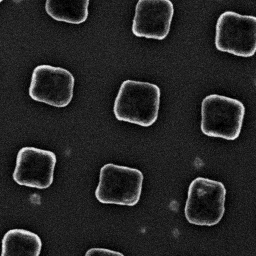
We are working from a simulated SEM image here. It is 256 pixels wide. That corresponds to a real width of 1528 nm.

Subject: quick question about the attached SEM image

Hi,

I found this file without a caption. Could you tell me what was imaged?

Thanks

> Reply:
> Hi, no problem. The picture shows raised bodies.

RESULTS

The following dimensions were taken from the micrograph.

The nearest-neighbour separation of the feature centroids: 0.503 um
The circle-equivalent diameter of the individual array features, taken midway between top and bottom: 262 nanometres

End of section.